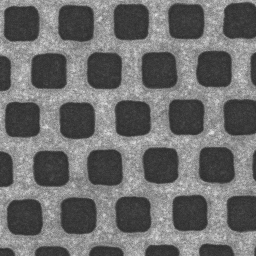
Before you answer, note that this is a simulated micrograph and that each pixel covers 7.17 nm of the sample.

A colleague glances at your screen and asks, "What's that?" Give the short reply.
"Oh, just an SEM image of a regular array of holes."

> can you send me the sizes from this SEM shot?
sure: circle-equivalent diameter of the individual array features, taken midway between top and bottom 0.278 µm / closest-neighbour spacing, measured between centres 392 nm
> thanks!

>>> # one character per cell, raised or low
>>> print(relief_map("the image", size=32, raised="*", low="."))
***************...****.*.****...
*....**.....**.....**.....**....
*....**.....**.....**.....**....
*....**.....**.....**.....**....
*....***....**....***....***....
********************************
********************.****...****
.***....***....***....***....**.
.***....***....***....***....**.
.***....***....***....***....**.
.***....***....***....***....***
********************************
**********************...****...
*....***....**.....**....***....
*....**.....**.....**....***....
*....**.....**.....**....***....
*....**.....***....***...***....
********************************
*******************..****...****
.***....***....***....***....***
..**.....**....***....***....***
..**.....**....***....***....***
..**.....**....***....***....***
********************************
**********************.*.*****..
*....***....***....***....**....
*....***....**.....***....**....
*....***....***....***....**....
*....***....***....***....***...
********************************
********************************
..**....***....***....***....***